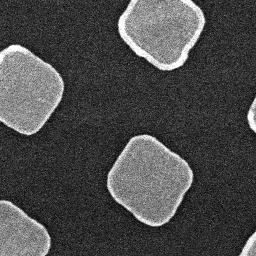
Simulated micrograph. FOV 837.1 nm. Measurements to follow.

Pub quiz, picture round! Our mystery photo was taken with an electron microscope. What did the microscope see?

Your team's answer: raised bodies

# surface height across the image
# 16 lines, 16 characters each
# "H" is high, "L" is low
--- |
LLLLLLLLHHHHLLLL
LLLLLLLHHHHHHLLL
LLLLLLLLHHHHLLLL
HHLLLLLLLHHHLLLL
HHHHLLLLLLLLLLLL
HHHHLLLLLLLLLLLL
HHHHLLLLLLLLLLLL
HHHLLLLLLLLLLLLL
LLLLLLLLLLLLLLLL
LLLLLLLLHHHLLLLL
LLLLLLLHHHHHLLLL
LLLLLLLHHHHHLLLL
LLLLLLLHHHHLLLLL
HHLLLLLLLHHLLLLL
HHHLLLLLLLLLLLLL
HHHLLLLLLLLLLLLH